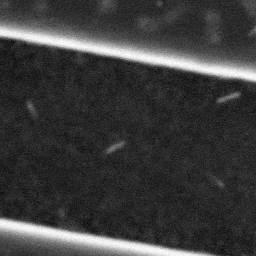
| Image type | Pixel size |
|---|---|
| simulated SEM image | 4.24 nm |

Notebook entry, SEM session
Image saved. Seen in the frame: one or a few lines or trenches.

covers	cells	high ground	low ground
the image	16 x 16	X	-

XXXXXXXXXXXXXXXX
XXXXXXXXXXXXXXXX
---XXXXXXXXXXXXX
--------XXXXXXXX
--------------XX
----------------
----------------
----------------
----------------
----------------
----------------
----------------
----------------
----------------
XXX-------------
XXXXXXXXX-------